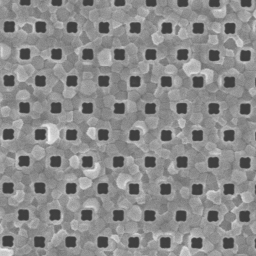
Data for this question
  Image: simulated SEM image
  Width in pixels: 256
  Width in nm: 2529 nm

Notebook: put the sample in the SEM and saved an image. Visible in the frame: a regular array of holes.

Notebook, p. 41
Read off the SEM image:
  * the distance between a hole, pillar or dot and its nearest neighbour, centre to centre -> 305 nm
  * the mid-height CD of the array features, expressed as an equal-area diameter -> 12.2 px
